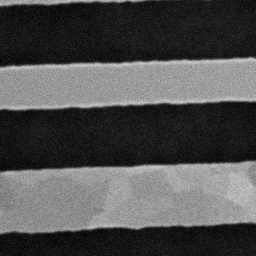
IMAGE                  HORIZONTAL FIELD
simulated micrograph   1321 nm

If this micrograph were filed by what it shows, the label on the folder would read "lines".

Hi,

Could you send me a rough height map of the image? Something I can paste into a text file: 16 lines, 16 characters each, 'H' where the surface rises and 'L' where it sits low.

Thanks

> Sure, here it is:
LLLLLLLLLLLLLLLL
LLLLLLLLLLLLLLLL
LLLLLLLLLLLLLLLL
LLLLLLLLLLLLLLLL
HHHHHHHHHHHHHHHH
HHHHHHHHHHHHHHHH
HHHHHHHHHLLLLLLL
LLLLLLLLLLLLLLLL
LLLLLLLLLLLLLLLL
LLLLLLLLLLLLLLLL
LLLLLHHHHHHHHHHH
HHHHHHHHHHHHHHHH
HHHHHHHHHHHHHHHH
HHHHHHHHHHHHHHHH
LLHLLLLLLLLLLLLL
LLLLLLLLLLLLLLLL